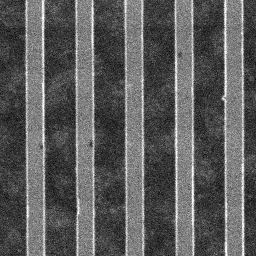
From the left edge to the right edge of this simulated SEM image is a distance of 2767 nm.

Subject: parallel lines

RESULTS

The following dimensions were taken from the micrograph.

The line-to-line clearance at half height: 173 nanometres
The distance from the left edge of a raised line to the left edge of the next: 49.6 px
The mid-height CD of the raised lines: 362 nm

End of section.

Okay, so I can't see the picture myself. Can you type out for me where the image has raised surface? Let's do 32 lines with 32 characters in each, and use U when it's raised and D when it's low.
UUUDDUUUUDDDUUUDDDUUUUDDUUUUDDUU
UUUDDDUUUDDDUUUUDDUUUUDDUUUUDDUU
UUUDDDUUUDDDUDDDDDUUUUDDUUUUDDUU
UUUDDUUUUDDDUUUDDDUUUUDDUUUUDDUU
UUUDDUUUUDDDUUUUDDUUUUDDUUUUDDUU
UUUDDUUUUDDDUUUUDDUUUUDDUUUUDDUU
UUUDDUUUUUDDUUUUDDUUUUDDUUUUDDUU
UUUDDUUUUUDDUUUUDDUUUUDDUUUUDDUU
UUUDDUUUUUDDUUUUDDUUUUDDUUUUDDUU
UUUDDUUUUUDDUUUUDDUUUUDDUUUUDDUU
UUUDDUUDUUDDUUUUDDUUUUDDUUUUDDUU
UUUDDUDDUUDDUDUUDDUUUUDDUUUUDDUU
UUUDDUDDUUDDUUUUDDUUUUDDUUUUDDUU
UUUDDUUUUUDDUUUUDDUUUUDDUUUUDDUU
UUUDDUUUUUDDUUUUDDUUUUDDUUUUDDUU
UUUDDUUUUUDDUUUUDDUUUUDDUUUUDDUU
UUUDDUUUUUDDUUUUDDUUUUDDUUUUDDUU
UUUDDUUUUUDDUUUUDDUUUUDDUUUUDDUU
UUUDDUUUUUDDUUUUDDUUDUDDUUUUDDUU
UUUDDUUUUUDDUUUUDDUUUUDDUUUUDDUU
UUUDDDUUUUDDUUUUDDUUUUDDUUUUDDUU
UUUDDDUUUUDDUUUUDDUUUUDDUUUUDDUU
UUUDDDUUUUDDUUUUDDUUUUDDUUUUDDUU
UUUDDDUUUUDDUUUUDDUUUUDDUUUUDDUU
UUUDDDUUUUDDUUUUDDUUUUDDUUUUDDUU
UUUDDDUUUUDDUUUUDDUUUUDDUUUUDDUU
UUUDDDUUUUDDUUUUDDUUUUDDUUUUDDUU
UUUDDDUUUUDDUUUUDDUUUUDDUUUUDDUU
UUUDDDUUUUDDUUUUDDUUUUDDUDUUDDUU
UUUDDDUUUUDDUUUUDDUUUUDDUUUUDDUU
UUUDDDUUUUDDUUUUDDUUUUDDUUUUDDUU
UUUDDDUUUUDDUUUUDDUUUUDDUUUDDDUU